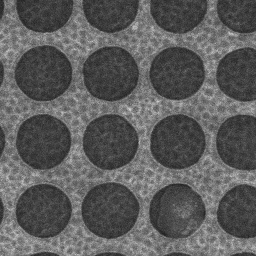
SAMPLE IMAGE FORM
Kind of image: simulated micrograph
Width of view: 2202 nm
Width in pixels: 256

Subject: a regular array of holes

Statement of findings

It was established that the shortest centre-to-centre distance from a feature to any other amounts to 573 nanometres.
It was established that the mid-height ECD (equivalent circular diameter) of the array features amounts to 483 nm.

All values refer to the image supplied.